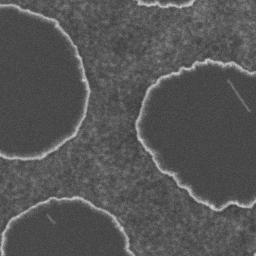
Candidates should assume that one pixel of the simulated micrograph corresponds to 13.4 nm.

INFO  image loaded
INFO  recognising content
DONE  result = raised bodies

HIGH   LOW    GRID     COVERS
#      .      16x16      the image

#...............
####............
####............
#####...........
#####......#####
######...#######
#####....#######
#####....#######
####.....#######
###......#######
..........######
...........#####
...##.......####
.######.........
########........
########........